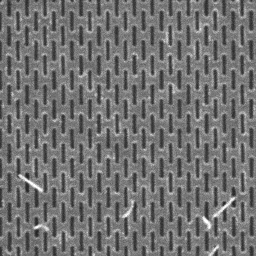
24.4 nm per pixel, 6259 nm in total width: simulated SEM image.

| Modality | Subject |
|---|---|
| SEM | a regular array of holes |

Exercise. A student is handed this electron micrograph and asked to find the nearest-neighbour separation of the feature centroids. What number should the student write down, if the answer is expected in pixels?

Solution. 16.7